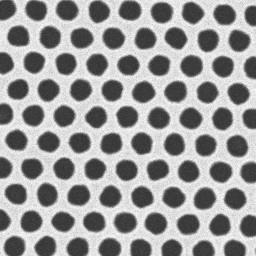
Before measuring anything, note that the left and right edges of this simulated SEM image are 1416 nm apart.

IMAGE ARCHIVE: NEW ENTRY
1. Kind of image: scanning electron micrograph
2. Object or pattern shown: a regular array of holes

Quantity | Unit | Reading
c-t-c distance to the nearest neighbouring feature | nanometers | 166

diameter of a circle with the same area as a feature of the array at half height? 119 nm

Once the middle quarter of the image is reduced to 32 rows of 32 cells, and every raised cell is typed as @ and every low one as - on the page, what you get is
---@@@-----@@------@@------@@---
--@@@@----@@@@-----@@-----@@@---
--@@@@@---@@@@@--@@@@@----@@@@--
@@@@@@@@@@@@@@@@@@@@@@@@@@@@@@@@
@@----@@@@@---@@@@@--@@@@@@---@@
@@-----@@@-----@@@----@@@@-----@
@------@@------@@------@@------@
@@-----@@@----@@@------@@------@
@@----@@@@----@@@-----@@@@----@@
@@@@@@@@@@@@@@@@@@@--@@@@@@@-@@@
@@@@@@@@@@@@@@@-@@@@@@@@@@@@@@@@
--@@@@@---@@@@----@@@@---@@@@@--
---@@@-----@@-----@@@-----@@@---
---@@------@@------@@------@@---
--@@@@----@@@@----@@@-----@@@---
-@@@@@@---@@@@---@@@@@----@@@@--
@@@@@@@@@@@@@@@@@@@@@@@@@@@@@@@@
@@@---@@@@@--@@@@@---@@@@@@--@@@
@-----@@@@----@@@-----@@@-----@@
@------@@-----@@@-----@@@-----@@
@@-----@@------@@-----@@@-----@@
@@----@@@-----@@@@----@@@-----@@
@@@@@@@@@@@-@@@@@@@--@@@@@---@@@
-@@@@@@@@@@@@@@@@@@@@@@@@@@@@@@@
--@@@@----@@@@---@@@@@---@@@@@--
---@@-----@@@-----@@@-----@@@---
---@@-----@@@------@@-----@@----
--@@@-----@@@-----@@@-----@@@---
--@@@@---@@@@@----@@@----@@@@---
@@@@@@@@@@@@@@@@@@@@@@@@@@@@@@@@
@@---@@@@@@-@@@@@@@-@@@@@@@@@@@@
@-----@@@@----@@@----@@@@----@@@